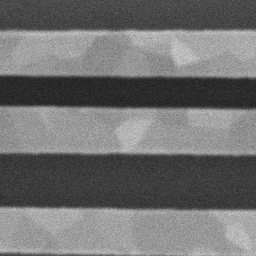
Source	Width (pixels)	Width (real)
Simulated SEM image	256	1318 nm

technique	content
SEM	lines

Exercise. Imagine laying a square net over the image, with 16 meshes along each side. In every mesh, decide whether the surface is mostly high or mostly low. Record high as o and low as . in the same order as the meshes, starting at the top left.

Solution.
................
................
oooooooooooooooo
oooooooooooooooo
oooooooooooooooo
................
................
oooooooooooooooo
oooooooooooooooo
oooooooooooooooo
................
................
................
oooooooooooooooo
oooooooooooooooo
oooooooooooooooo